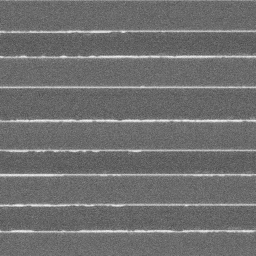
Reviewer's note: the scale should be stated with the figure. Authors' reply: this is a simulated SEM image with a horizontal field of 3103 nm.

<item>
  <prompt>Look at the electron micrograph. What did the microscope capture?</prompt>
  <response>lines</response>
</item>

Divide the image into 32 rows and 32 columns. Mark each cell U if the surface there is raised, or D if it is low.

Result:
UUUUUUUUUUUUUUUUUUUUUUUUUUUUUUUU
UUUUUUUUUUUUUUUUUUUUUUUUUUUUUUUU
UUUUUUUUUUUUUUUUUUUUUUUUUUUUUUUU
UUUUUUUUUUUUUUUUUUUUUUUUUUUUUUUU
DDDDDDDDDDDDDDDDDDDDDDDDDDDDDDDD
DDDDDDDDDDDDDDDDDDDDDDDDDDDDDDDD
DDDDDDDDDDDDDDDDDDDDDDDDDDDDDDDD
UUUUUUUUUUUUUUUUUUUUUUUUUUUUUUUU
UUUUUUUUUUUUUUUUUUUUUUUUUUUUUUUU
UUUUUUUUUUUUUUUUUUUUUUUUUUUUUUUU
UUUUUUUUUUUUUUUUUUUUUUUUUUUUUUUU
DDDDDDDDDDDDDDDDDDDDDDDDDDDDDDDD
DDDDDDDDDDDDDDDDDDDDDDDDDDDDDDDD
DDDDDDDDDDDDDDDDDDDDDDDDDDDDDDDD
DDDDDDDDDDDDDDDDDDDDDDDDDDDDDDDD
UUUUUUUUUUUUUUUUUUUUUUUUUUUUUUUU
UUUUUUUUUUUUUUUUUUUUUUUUUUUUUUUU
UUUUUUUUUUUUUUUUUUUUUUUUUUUUUUUU
UUUUUUUUUUUUUUUUUUUUUUUUUUUUUUUU
DDDDDDDDDDDDDDDDDDDDDDDDDDDDDDDD
DDDDDDDDDDDDDDDDDDDDDDDDDDDDDDDD
DDDDDDDDDDDDDDDDDDDDDDDDDDDDDDDD
UUUUUUUUUUUUUUUUUUUUUUUUUUUUUUUU
UUUUUUUUUUUUUUUUUUUUUUUUUUUUUUUU
UUUUUUUUUUUUUUUUUUUUUUUUUUUUUUUU
UUUUUUUUUUUUUUUUUUUUUUUUUUUUUUUU
DDDDDDDDDDDDDDDDDDDDDDDDDDDDDDDD
DDDDDDDDDDDDDDDDDDDDDDDDDDDDDDDD
DDDDDDDDDDDDDDDDDDDDDDDDDDDDDDDD
UUUUUUUUUUUUUUUUUUUUUUUUUUUUUUUU
UUUUUUUUUUUUUUUUUUUUUUUUUUUUUUUU
UUUUUUUUUUUUUUUUUUUUUUUUUUUUUUUU